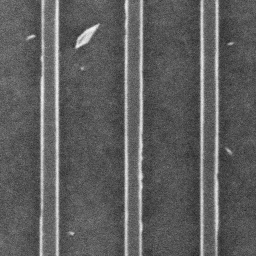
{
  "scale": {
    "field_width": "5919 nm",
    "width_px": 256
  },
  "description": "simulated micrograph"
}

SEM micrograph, lines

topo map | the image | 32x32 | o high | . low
.....oo.........oo.......oo.....
.....oo.........oo.......oo.....
.....oo.........oo.......oo.....
.....oo.........oo.......oo.....
.....oo...o.....oo.......oo.....
.....oo.........oo.......oo.....
.....oo.........oo.......oo.....
.....oo.........oo.......oo.....
.....oo.........oo.......oo.....
.....oo.........oo.......oo.....
.....oo.........oo.......oo.....
.....oo.........oo.......oo.....
.....oo.........oo.......oo.....
.....oo.........oo.......oo.....
.....oo.........oo.......oo.....
.....oo.........oo.......oo.....
.....oo.........oo.......oo.....
.....oo.........oo.......oo.....
.....oo.........oo.......oo.....
.....oo.........oo.......oo.....
.....oo.........oo.......oo.....
.....oo.........oo.......oo.....
.....oo.........oo.......oo.....
.....oo.........oo.......oo.....
.....oo.........oo.......oo.....
.....oo.........oo.......oo.....
.....oo.........oo.......oo.....
.....oo.........oo.......oo.....
.....oo.........oo.......oo.....
.....oo.........oo.......oo.....
.....oo.........oo.......oo.....
.....oo.........oo.......oo.....